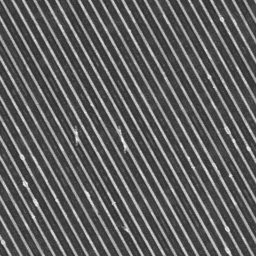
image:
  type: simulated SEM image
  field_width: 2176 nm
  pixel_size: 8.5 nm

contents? parallel lines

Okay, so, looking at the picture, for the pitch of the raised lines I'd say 0.082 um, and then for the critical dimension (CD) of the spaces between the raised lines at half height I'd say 61.3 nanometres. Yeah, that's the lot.